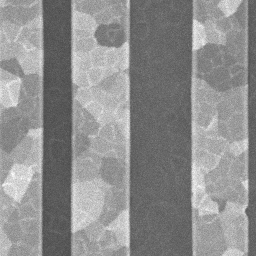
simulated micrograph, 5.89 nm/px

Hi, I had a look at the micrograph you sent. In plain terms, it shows one or a few lines or trenches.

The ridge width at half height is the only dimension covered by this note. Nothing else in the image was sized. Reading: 0.325 micrometres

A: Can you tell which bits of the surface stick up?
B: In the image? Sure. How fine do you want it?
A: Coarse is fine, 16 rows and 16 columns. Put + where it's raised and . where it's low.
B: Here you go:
+++..+++....+++.
+++..+++....+++.
+++..+++....+++.
+++..+++....+++.
+++..+++....+++.
+++..+++....+++.
+++..+++....+++.
+++..+++....+++.
+++..+++....+++.
+++..+++....+++.
+++..+++....+++.
+++..+++....+++.
+++..+++....+++.
+++..+++....+++.
+++..+++....+++.
+++..+++....+++.